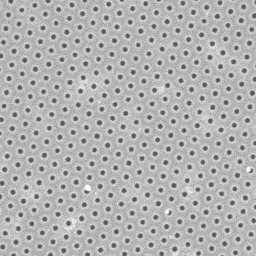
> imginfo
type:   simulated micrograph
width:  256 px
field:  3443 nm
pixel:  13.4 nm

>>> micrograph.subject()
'a regular array of holes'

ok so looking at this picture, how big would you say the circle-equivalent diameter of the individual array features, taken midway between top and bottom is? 69.5 nm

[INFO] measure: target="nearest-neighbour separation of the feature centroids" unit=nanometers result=184